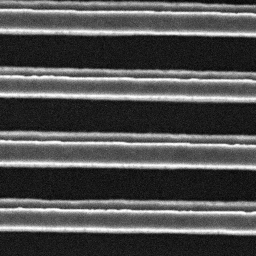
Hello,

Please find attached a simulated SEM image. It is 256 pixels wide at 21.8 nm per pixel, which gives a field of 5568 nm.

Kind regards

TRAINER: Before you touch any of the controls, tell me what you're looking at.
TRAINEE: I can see lines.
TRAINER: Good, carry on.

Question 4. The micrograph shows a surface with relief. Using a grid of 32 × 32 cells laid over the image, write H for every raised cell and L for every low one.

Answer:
HHHHHHHHHHHHHLLLLLLLLLLLLLLLLLLL
HHHHHHHHHHHHHHHHHHHHHHHHHHHHHHHH
HHHHHHHHHHHHHHHHHHHHHHHHHHHHHHHH
HHHHHHHHHHHHHHHHHHHHHHHHHHHHHHHH
LLLLLLLLLLLLLLLLLLLLLLLLLLLLLLLL
LLLLLLLLLLLLLLLLLLLLLLLLLLLLLLLL
LLLLLLLLLLLLLLLLLLLLLLLLLLLLLLLL
LLLLLLLLLLLLLLLLLLLLLLLLLLLLLLLL
LLLLLLLLLLLLLLLLLLLLLLLLLLLLLLLL
HHHHHHHHHHHHHHHHHHHHHHHHHHHHHHHH
HHHHHHHHHHHHHHHHHHHHHHHHHHHHHHHH
HHHHHHHHHHHHHHHHHHHHHHHHHHHHHHHH
LLLLLLLLLLLLLLLLLLLLLLLLLLLLLLLL
LLLLLLLLLLLLLLLLLLLLLLLLLLLLLLLL
LLLLLLLLLLLLLLLLLLLLLLLLLLLLLLLL
LLLLLLLLLLLLLLLLLLLLLLLLLLLLLLLL
LLLLLLLLLLLLLLLLLLLLLLLLLLLLLLLL
HHHHHHHHHHHHHHHHHHHHHHHHHHHHHHHH
HHHHHHHHHHHHHHHHHHHHHHHHHHHHHHHH
HHHHHHHHHHHHHHHHHHHHHHHHHHHHHHHH
LLLLLHHHHHHHHHHHHHHHHHHHHHHHHHHH
LLLLLLLLLLLLLLLLLLLLLLLLLLLLLLLL
LLLLLLLLLLLLLLLLLLLLLLLLLLLLLLLL
LLLLLLLLLLLLLLLLLLLLLLLLLLLLLLLL
LLLLLLLLLLLLLLLLLLLLLLLLLLLLLLLL
HHHHHHHHHHHHHHHHHHHHHHLLLLLLLLLL
HHHHHHHHHHHHHHHHHHHHHHHHHHHHHHHH
HHHHHHHHHHHHHHHHHHHHHHHHHHHHHHHH
HHHHHHHHHHHHHHHHHHHHHHHHHHHHHHHH
LLLLLLLLLLLLLLLLLLLLLLLLLLLLLLLL
LLLLLLLLLLLLLLLLLLLLLLLLLLLLLLLL
LLLLLLLLLLLLLLLLLLLLLLLLLLLLLLLL